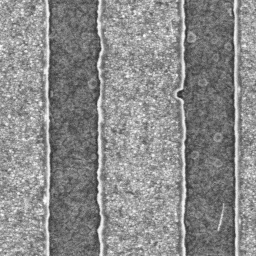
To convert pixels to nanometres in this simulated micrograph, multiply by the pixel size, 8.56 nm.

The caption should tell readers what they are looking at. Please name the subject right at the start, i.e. one or a few lines or trenches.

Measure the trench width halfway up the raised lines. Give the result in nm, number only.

444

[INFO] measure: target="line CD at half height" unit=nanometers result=724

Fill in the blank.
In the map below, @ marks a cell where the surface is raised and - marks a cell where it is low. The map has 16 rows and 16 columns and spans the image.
@@@---@@@@@----@
@@@---@@@@@----@
@@@---@@@@@----@
@@@---@@@@@----@
@@@---@@@@@@---@
@@@---@@@@@----@
@@@---@@@@@----@
@@@---@@@@@@---@
@@@---@@@@@@---@
@@@---@@@@@----@
@@@---@@@@@@---@
@@@---@@@@@@---@
@@@---@@@@@@---@
@@@---@@@@@----@
@@@---@@@@@@---@
@@@---@@@@@@---@